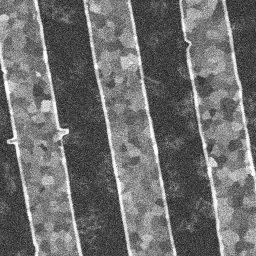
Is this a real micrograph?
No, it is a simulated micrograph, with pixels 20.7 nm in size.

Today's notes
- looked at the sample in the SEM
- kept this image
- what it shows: one or a few lines or trenches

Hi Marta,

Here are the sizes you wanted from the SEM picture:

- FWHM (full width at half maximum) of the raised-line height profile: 908 nm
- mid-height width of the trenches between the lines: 0.999 micrometres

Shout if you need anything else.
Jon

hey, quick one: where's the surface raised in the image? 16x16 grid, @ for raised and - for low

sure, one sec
@@---@@@---@@@--
@@@---@@---@@@--
@@@---@@@---@@--
@@@---@@@---@@@-
@@@---@@@---@@@-
@@@---@@@---@@@-
-@@---@@@---@@@-
-@@@---@@---@@@-
-@@@---@@@---@@-
-@@@---@@@---@@@
-@@@---@@@---@@@
-@@@---@@@---@@@
--@@----@@---@@@
--@@@---@@----@@
--@@@---@@@---@@
--@@@---@@@---@@